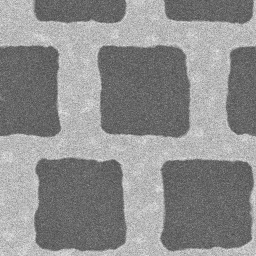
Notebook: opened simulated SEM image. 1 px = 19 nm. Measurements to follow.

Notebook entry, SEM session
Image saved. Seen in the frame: holes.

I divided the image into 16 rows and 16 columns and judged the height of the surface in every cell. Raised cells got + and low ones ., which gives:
++......++......
++++++++++++++++
++++++++++++++++
....++......++..
....++......++..
....++......++..
....++......++..
....++......++..
++.+++++++.+++++
++++++++++++++++
++......++......
++......++......
++......++......
++......++......
++......++......
+++....+++...+.+